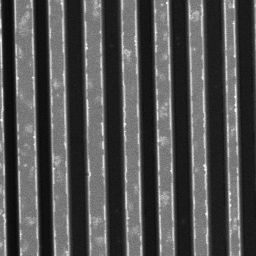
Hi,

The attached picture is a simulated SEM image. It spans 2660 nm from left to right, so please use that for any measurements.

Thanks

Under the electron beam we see parallel lines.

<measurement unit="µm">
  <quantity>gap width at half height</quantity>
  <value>0.174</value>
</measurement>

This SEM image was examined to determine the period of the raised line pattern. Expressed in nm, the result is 356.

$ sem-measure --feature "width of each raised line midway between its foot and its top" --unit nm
184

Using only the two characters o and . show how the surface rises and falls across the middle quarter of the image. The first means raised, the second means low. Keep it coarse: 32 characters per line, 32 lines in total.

.....ooooo....ooooo....oooo....o
.....ooooo....ooooo....oooo....o
.....ooooo.....oooo....oooo....o
o....ooooo.....oooo....oooo....o
o....ooooo.....oooo....oooo....o
o....ooooo.....oooo....oooo....o
o....ooooo.....oooo....oooo....o
o....ooooo.....oooo....oooo....o
o....ooooo.....oooo....oooo....o
o....ooooo.....oooo....oooo....o
o....ooooo.....oooo....oooo....o
o....ooooo.....oooo....oooo....o
o....ooooo.....oooo....oooo....o
o....ooooo.....oooo....oooo.....
o....ooooo.....oooo....oooo.....
o....ooooo.....oooo....oooo.....
o....ooooo.....oooo....oooo.....
o.....oooo.....oooo....oooo.....
o.....oooo.....oooo....oooo.....
o.....oooo.....oooo....oooo.....
o.....oooo.....oooo....oooo.....
o.....oooo.....oooo....oooo.....
o.....oooo.....oooo....oooo.....
o.....oooo.....oooo....oooo.....
o.....oooo.....oooo....oooo.....
o.....oooo.....oooo....oooo.....
o.....oooo.....oooo....oooo.....
o.....oooo.....oooo....oooo.....
o.....oooo.....oooo....oooo.....
o.....oooo.....oooo....oooo.....
o.....ooooo....oooo....oooo.....
o.....ooooo....oooo....ooooo....